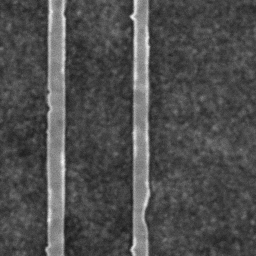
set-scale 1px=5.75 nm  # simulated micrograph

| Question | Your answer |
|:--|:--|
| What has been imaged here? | one or a few lines or trenches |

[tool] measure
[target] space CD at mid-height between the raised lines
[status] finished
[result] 399 nm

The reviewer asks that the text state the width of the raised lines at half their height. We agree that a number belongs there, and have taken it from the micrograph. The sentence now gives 82.6 nm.